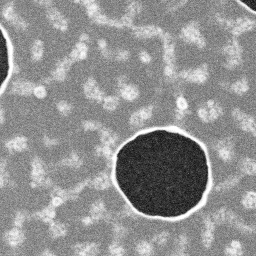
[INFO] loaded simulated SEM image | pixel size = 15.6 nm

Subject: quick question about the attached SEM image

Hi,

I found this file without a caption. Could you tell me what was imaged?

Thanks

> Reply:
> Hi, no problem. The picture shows holes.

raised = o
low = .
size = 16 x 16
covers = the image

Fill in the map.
oooooooooooooooo
oooooooooooooooo
oooooooooooooooo
.ooooooooooooooo
.ooooooooooooooo
oooooooooooooooo
oooooooooooooooo
oooooooooooooooo
ooooooooo...oooo
ooooooo......ooo
ooooooo......ooo
ooooooo......ooo
oooooooo.....ooo
ooooooooo..ooooo
oooooooooooooooo
oooooooooooooooo